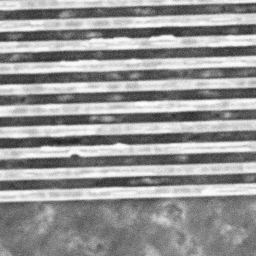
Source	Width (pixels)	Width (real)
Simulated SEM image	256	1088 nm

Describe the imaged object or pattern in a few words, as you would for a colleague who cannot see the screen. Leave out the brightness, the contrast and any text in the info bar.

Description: parallel lines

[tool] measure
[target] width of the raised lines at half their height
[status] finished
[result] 38.3 nanometres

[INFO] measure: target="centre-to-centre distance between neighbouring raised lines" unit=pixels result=21.2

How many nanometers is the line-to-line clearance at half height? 53.1